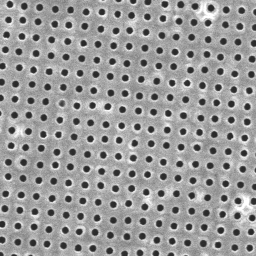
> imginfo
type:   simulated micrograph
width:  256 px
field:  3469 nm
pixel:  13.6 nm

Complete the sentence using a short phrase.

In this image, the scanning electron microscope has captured a regular array of holes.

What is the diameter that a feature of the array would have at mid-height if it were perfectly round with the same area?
97.9 nanometres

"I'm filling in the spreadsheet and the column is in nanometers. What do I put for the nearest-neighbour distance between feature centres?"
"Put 200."